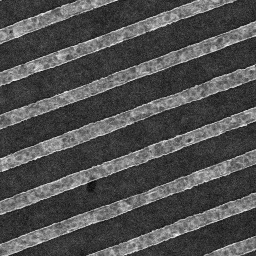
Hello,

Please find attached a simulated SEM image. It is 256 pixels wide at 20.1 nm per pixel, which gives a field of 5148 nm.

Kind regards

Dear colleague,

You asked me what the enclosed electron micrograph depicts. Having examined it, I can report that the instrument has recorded parallel lines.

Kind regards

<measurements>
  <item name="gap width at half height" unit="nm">564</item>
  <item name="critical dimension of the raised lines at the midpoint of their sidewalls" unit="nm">248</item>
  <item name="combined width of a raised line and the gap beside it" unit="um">0.808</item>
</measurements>